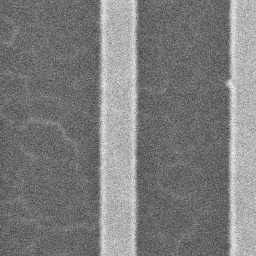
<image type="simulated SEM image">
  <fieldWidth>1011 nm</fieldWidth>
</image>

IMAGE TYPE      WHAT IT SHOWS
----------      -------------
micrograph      one or a few lines or trenches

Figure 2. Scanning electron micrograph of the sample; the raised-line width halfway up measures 0.122 um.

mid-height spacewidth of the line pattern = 390 nm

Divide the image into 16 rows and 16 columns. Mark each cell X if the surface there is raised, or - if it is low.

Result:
------XX-------X
------XX-------X
------XX-------X
-------X-------X
------XX-------X
------XX-------X
------XX-------X
------XX-------X
------XX-------X
------XX-------X
------XX-------X
------XX-------X
------XX-------X
------XX-------X
------XX-------X
------XX-------X